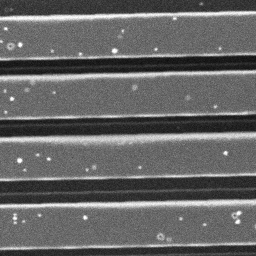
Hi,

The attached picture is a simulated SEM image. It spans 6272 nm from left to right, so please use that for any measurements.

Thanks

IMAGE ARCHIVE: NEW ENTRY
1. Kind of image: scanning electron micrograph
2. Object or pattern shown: lines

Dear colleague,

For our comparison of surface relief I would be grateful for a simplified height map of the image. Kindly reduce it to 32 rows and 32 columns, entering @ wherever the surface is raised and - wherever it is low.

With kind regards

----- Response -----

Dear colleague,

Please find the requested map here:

--------------------------------
-----------------------------@@@
@@@@@@@@@@@@@@@@@@@@@@@@@@@@@@@@
@@@@@@@@@@@@@@@@@@@@@@@@@@@@@@@@
@@@@@@@@@@@@@@@@@@@@@@@@@@@@@@@@
@@@@@@@@@@@@@@@@@@@@@@@@@@@@@@@@
@@@@@@@@@@@@@@@@@@@@@@@@@@@@@@@@
--------------------------------
--------------------------------
---@@@@@@@@@@@@@@@@@@@@@@@@@@@@@
@@@@@@@@@@@@@@@@@@@@@@@@@@@@@@@@
@@@@@@@@@@@@@@@@@@@@@@@@@@@@@@@@
@@@@@@@@@@@@@@@@@@@@@@@@@@@@@@@@
@@@@@@@@@@@@@@@@@@@@@@@@@@@@@@@@
@@@@@@@@@@@@@@@@@@@@@-----------
--------------------------------
--------------------------------
@@@@@@@@@@@@@@@@@@@@@@@@@@@@@@@@
@@@@@@@@@@@@@@@@@@@@@@@@@@@@@@@@
@@@@@@@@@@@@@@@@@@@@@@@@@@@@@@@@
@@@@@@@@@@@@@@@@@@@@@@@@@@@@@@@@
@@@@@@@@@@@@@@@@@@@@@@@@@@@@@@@@
@@------------------------------
--------------------------------
--------------------------------
------@@@@@@@@@@@@@@@@@@@@@@@@@@
@@@@@@@@@@@@@@@@@@@@@@@@@@@@@@@@
@@@@@@@@@@@@@@@@@@@@@@@@@@@@@@@@
@@@@@@@@@@@@@@@@@@@@@@@@@@@@@@@@
@@@@@@@@@@@@@@@@@@@@@@@@@@@@@@@@
@@@@@@@@@@@@@@@@@@@@@@@@@@@@@@@@
--------------------------------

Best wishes